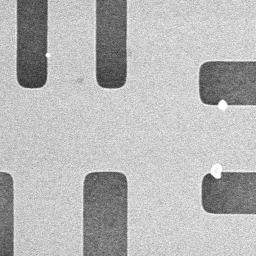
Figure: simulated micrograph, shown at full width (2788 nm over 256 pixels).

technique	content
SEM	groups of lines, slits or small figures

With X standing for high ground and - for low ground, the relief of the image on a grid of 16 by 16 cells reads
X--XXX--XXXXXXXX
X--XXX--XXXXXXXX
X--XXX--XXXXXXXX
X--XXX--XXXXXXXX
X--XXX--XXXX----
XXXXXXXXXXXX----
XXXXXXXXXXXXXX--
XXXXXXXXXXXXXXXX
XXXXXXXXXXXXXXXX
XXXXXXXXXXXXXXXX
XXXXXXXXXXXXXXXX
-XXXX---XXXXX---
-XXXX---XXXXX---
-XXXX---XXXXXXXX
-XXXX---XXXXXXXX
-XXXX---XXXXXXXX